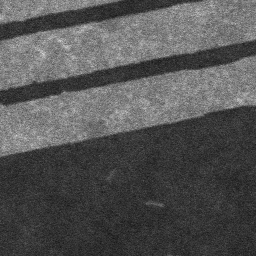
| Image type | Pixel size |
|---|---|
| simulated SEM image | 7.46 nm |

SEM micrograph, one or a few lines or trenches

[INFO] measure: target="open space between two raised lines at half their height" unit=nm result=134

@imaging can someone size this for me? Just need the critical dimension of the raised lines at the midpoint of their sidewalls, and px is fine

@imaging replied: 47.5